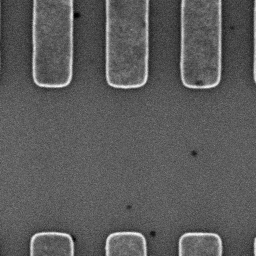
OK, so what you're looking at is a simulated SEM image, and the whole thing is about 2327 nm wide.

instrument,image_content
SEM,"wiring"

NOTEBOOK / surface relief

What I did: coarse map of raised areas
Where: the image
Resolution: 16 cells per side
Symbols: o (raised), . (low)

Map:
..oo...oo..ooo..
..oo...oo..ooo..
..oo...oo..ooo..
..oo...oo..ooo..
..oo...oo..ooo..
................
................
................
................
................
................
................
................
................
................
..ooo..oo..ooo..